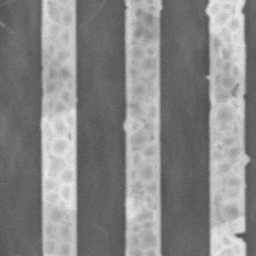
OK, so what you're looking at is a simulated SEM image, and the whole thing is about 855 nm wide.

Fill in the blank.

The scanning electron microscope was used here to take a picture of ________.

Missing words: one or a few lines or trenches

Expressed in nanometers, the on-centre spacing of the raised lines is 280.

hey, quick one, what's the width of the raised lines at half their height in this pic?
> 30.4 pixels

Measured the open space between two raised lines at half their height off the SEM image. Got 179 nm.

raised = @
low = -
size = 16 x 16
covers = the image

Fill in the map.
---@@---@@---@@-
---@@---@@---@@-
---@@---@@---@@-
---@@---@@---@@-
---@@---@@---@@-
---@@---@@---@@-
---@@---@@---@@-
---@@---@@---@@-
---@@---@@---@@-
---@@---@@---@@-
---@@---@@---@@-
---@@---@@---@@-
---@@---@@---@@-
---@@---@@---@@-
---@@---@@---@@-
---@@---@@---@@-